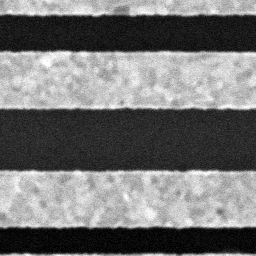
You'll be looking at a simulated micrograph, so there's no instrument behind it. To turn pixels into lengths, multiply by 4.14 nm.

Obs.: lines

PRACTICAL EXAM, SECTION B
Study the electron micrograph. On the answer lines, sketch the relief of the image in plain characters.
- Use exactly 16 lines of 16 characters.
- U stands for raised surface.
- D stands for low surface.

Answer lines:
UUUUUUUUUUUUUUUU
DDDDDDDDDDDDDDDD
DDDDDDDDDDDDDDDD
UUUUUUUUUUUUUUUU
UUUUUUUUUUUUUUUU
UUUUUUUUUUUUUUUU
UUUUUUUUUUUUUUUU
DDDDDDDDDDDDDDDD
DDDDDDDDDDDDDDDD
DDDDDDDDDDDDDDDD
DDDDDDDDDDDDDDDD
UUUUUUUUUUUUUUUU
UUUUUUUUUUUUUUUU
UUUUUUUUUUUUUUUU
DDDDDDDDDDDDDDDD
DDDDDDDDDDDDDDDD